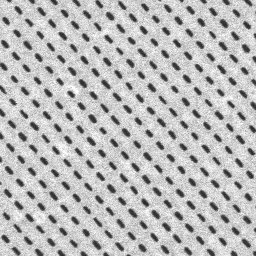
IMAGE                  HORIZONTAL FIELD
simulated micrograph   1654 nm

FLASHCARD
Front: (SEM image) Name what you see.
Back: a regular array of holes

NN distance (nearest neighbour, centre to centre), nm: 102